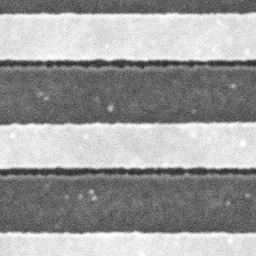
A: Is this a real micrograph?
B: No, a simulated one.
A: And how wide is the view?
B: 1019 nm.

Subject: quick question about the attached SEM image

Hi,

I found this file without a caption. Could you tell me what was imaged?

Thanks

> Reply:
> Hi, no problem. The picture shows lines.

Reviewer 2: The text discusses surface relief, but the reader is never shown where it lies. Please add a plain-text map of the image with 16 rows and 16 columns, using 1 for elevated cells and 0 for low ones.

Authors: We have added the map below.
0000000000000000
1111111111111111
1111111111111111
1111111111111111
0000000000000000
0000000000000000
0000000000000000
0000000000000000
1111111111111111
1111111111111111
0000000000000000
0000000000000000
0000000000000000
0000000000000000
0000000000000000
1111111111111111